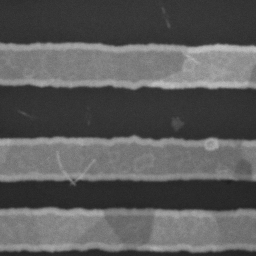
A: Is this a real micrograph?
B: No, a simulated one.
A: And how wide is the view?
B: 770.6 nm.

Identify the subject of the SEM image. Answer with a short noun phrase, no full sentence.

lines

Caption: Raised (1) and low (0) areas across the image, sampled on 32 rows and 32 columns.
00000000000000000000000000000000
00000000000000000000000000000000
00000000000000000000000000000000
00000000000000000000000000000000
00000000000000000000000000000000
00000000000000000000000000000000
11111111111111111111111111111111
11111111111111111111111111111111
11111111111111111111111111111111
11111111111111111111111111111111
01101111111111111111111111111111
00000000000000000000000000000000
00000000000000000000000000000000
00000000000000000000000000000000
00000000000000000000000000000000
00000000000000000000000000000000
00000000000000000000000000000000
00011111111110111100110000100000
11111111111111111111111111111111
11111111111111111111111111111111
11111111111111111111111111111111
11111111111111111111111111111111
00000000000000000000000000000000
00000000000000000000000000000000
00000000000000000000000000000000
00000000000000000000000000000000
11111111111111111111111111101111
11111111111111111111111111111111
11111111111111111111111111111111
11111111111111111111111111111111
11111111111111111111111111111111
00000000000000000000000000000000